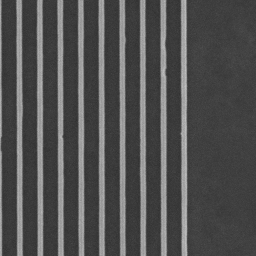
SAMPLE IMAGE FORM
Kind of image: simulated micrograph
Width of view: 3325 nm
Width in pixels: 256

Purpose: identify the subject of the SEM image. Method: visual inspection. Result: parallel lines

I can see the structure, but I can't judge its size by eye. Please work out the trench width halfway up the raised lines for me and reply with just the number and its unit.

206 nanometres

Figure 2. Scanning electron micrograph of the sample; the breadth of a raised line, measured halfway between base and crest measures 55.2 nanometres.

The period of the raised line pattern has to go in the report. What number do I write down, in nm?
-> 267